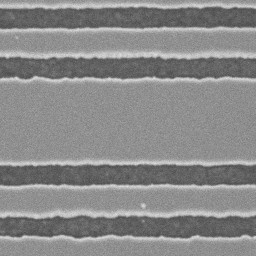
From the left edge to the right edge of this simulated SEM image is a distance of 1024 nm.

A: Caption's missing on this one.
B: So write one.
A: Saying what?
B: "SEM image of lines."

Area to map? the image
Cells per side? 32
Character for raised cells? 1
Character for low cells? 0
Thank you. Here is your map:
11111111111111111111111111111111
00000000000000000000000000000000
00000000000000000000000000000000
00000000001111100001111110111111
11111111111111111111111111111111
11111111111111111111111111111111
11111111111111111111111111111111
00000000000000000000000000000000
00000000000000000000000000000000
00000000000000000000000000000000
11111111111111111111111111111111
11111111111111111111111111111111
11111111111111111111111111111111
11111111111111111111111111111111
11111111111111111111111111111111
11111111111111111111111111111111
11111111111111111111111111111111
11111111111111111111111111111111
11111111111111111111111111111111
11111111111111111111111111111111
11111111111111111111111111111111
00000000000000000000000000000000
00000000000000000000000000000000
11111111111111111111111111111111
11111111111111111111111111111111
11111111111111111111111111111111
11111111111111111111111111111111
00000000000000000000000000000000
00000000000000000000000000000000
00010001000001100000000010000010
11111111111111111111111111111111
11111111111111111111111111111111